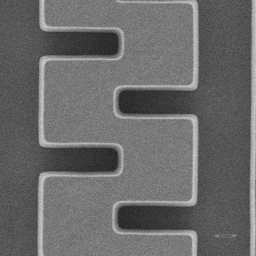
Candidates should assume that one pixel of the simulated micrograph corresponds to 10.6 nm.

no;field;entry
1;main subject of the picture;groups of lines, slits or small figures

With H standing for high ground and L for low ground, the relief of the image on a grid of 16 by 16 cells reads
LLLHHHHHHHHHLLLL
LLLHHHHHHHHHLLLL
LLLLLLLLHHHHLLLL
LLLLLLLHHHHHLLLL
LLLHHHHHHHHHLLLL
LLLHHHHHLLLLLLLL
LLLHHHHLLLLLLLLL
LLLHHHHHHHHHLLLL
LLLHHHHHHHHHLLLL
LLLLLLLHHHHHLLLL
LLLLLLLHHHHHLLLL
LLLHHHHHHHHHLLLL
LLLHHHHHHHHHLLLL
LLLHHHHLLLLLLLLL
LLLHHHHHLLLLLLLL
LLLHHHHHHHHHLLLL